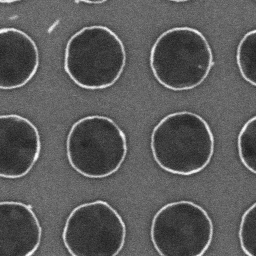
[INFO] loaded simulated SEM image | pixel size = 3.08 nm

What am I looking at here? raised bodies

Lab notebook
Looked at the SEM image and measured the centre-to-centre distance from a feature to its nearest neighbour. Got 264 nm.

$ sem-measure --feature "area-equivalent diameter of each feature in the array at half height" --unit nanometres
188